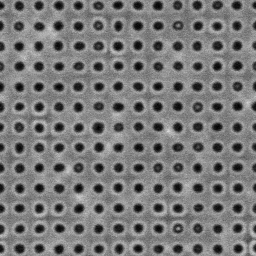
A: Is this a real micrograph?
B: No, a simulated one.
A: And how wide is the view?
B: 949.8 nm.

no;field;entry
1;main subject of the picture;a regular array of holes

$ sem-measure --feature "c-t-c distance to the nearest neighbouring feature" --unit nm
72.4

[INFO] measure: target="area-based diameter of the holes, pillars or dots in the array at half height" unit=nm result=39.7